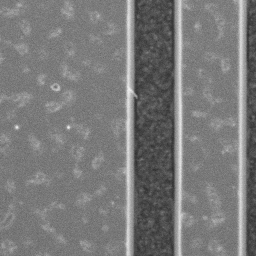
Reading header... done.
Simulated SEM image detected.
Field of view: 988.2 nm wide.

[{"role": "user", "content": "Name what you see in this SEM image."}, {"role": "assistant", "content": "one or a few lines or trenches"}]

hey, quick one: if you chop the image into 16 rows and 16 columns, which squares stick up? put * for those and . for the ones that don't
********...****.
********...****.
********...****.
********...****.
********...****.
********...****.
********...****.
********...****.
********...****.
********...****.
********...****.
********...****.
********...****.
********...****.
********...****.
********...****.